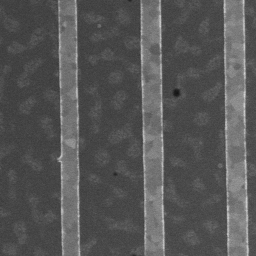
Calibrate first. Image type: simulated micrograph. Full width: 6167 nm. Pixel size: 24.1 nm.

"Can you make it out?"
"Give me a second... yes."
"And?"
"one or a few lines or trenches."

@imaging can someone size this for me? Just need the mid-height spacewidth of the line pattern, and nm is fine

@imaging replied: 1550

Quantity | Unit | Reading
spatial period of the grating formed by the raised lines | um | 2